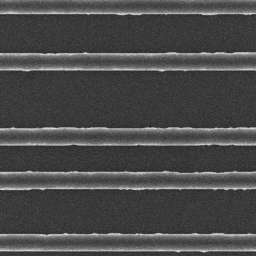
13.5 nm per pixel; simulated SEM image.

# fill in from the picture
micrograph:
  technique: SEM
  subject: lines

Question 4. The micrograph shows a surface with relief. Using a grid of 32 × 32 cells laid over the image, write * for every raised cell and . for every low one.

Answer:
********************************
********************************
................................
................................
................................
................................
................................
********************************
********************************
................................
................................
................................
................................
................................
................................
................................
********************************
********************************
................................
................................
................................
...*.....*..........*...........
********************************
********************************
................................
................................
................................
................................
................................
********************************
********************************
................................